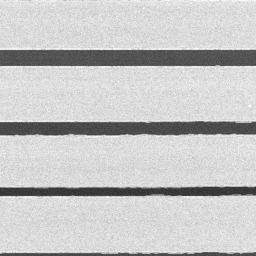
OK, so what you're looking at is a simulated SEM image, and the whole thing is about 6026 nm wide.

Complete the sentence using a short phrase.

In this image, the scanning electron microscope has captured lines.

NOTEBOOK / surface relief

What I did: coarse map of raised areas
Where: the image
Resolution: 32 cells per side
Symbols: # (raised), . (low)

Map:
################################
################################
################################
################################
################################
################################
................................
................................
################################
################################
################################
################################
################################
################################
################################
................................
................................
################################
################################
################################
################################
################################
################################
................................
................................
################################
################################
################################
################################
################################
################################
########...........##...........